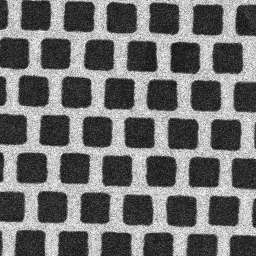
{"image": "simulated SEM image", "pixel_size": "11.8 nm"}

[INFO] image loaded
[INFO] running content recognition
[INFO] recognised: a regular array of holes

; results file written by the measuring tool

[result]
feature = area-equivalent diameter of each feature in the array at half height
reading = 0.401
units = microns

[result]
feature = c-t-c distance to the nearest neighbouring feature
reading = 506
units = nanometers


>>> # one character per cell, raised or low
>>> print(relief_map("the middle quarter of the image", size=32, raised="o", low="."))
.oooo........ooo.......ooo......
oooooo......oooo.......oooo.....
oooooooooooooooooooooooooooooo..
......ooooo......ooooooooooooooo
.......ooo........ooo.......oooo
.......ooo........ooo.......oooo
.......ooo........ooo.......oooo
.......ooo........ooo........ooo
.......ooo........ooo.......oooo
.......ooo........ooo.......ooo.
......oooo.......oooo........ooo
oooooooooooooo..oooooo......oooo
oooooooooooooooooooooooooooooooo
.oooo.......oooo......ooooo..ooo
..ooo.......ooo........ooo......
..oo........ooo........ooo......
..oo........ooo........ooo......
..oo........ooo........ooo......
.ooo........ooo........ooo......
.oooo.......ooo........ooo......
ooooo.......oooo......oooo......
ooooooooooooooooooooooooooooooo.
......oooooooooooooooooooooooooo
......oooo.......oooo.......oooo
.......oo........ooo........ooo.
.......oo........ooo........ooo.
......ooo........oooo.......ooo.
......ooo........ooo........ooo.
......ooo........ooo........ooo.
......oooo.......oooo.......ooo.
oooooooooo.......ooooo.....oooo.
oooooooooooooooooooooooooooooooo